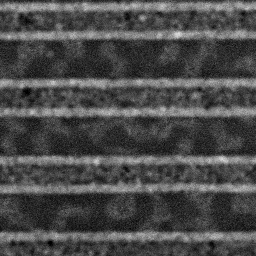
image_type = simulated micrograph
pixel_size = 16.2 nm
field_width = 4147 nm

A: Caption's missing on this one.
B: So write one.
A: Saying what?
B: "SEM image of one or a few lines or trenches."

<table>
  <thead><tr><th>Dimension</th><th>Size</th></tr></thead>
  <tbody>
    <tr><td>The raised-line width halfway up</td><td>0.445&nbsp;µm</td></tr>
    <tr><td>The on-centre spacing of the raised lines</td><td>1240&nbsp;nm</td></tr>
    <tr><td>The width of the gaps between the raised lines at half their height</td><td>0.783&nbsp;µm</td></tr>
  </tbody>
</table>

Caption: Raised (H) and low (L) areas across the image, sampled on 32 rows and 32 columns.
LLLLLLLLLLLLLLLLLLLLLLLLLLLLLLLL
HHHHHHHHHHHHHHHHHHHHHHHHHHHHHHHH
HHHHHHHHHHHHHHHHHHHHHHHHHHHHHHHH
HHHHHHHHHHHHHHHHHHHHHHHHHHHHHHHH
LLLLLLLLLLLLLLLLLLLLLLLLLLLLLLLL
LLLLLLLLLLLLLLLLLLLLLLLLLLLLLLLL
LLLLLLLLLLLLLLLLLLLLLLLLLLLLLLLL
LLLLLLLLLLLLLLLLLLLLLLLLLLLLLLLL
LLLLLLLLLLLLLLLLLLLLLLLLLLLLLLLL
LLLLLLLLLLLLLLLLLLLLLLLLLLLLLLLL
LLLLLLLHHHHHHHHHHHHHHHHHHHHHLLLL
HHHHHHHHHHHHHHHHHHHHHHHHHHHHHHHH
HHHHHHHHHHHHHHHHHHHHHHHHHHHHHHHH
HHHHHHHHHHHHHHHHHHHHHHHHHHHHHHHH
LLLLLLLLLLLLLLLLLLLLLLLLLLLLLLLL
LLLLLLLLLLLLLLLLLLLLLLLLLLLLLLLL
LLLLLLLLLLLLLLLLLLLLLLLLLLLLLLLL
LLLLLLLLLLLLLLLLLLLLLLLLLLLLLLLL
LLLLLLLLLLLLLLLLLLLLLLLLLLLLLLLL
LLLLLLLLLLLLLLLLLLLLLLLLLLLLLLLL
HHHHHHHHHHHHHHHHHHHHHHHHHHHHHHHH
HHHHHHHHHHHHHHHHHHHHHHHHHHHHHHHH
HHHHHHHHHHHHHHHHHHHHHHHHHHHHHHHH
HHHHHHHHHHHHHHHHHHLLLLLLLLLLLLLL
LLLLLLLLLLLLLLLLLLLLLLLLLLLLLLLL
LLLLLLLLLLLLLLLLLLLLLLLLLLLLLLLL
LLLLLLLLLLLLLLLLLLLLLLLLLLLLLLLL
LLLLLLLLLLLLLLLLLLLLLLLLLLLLLLLL
LLLLLLLLLLLLLLLLLLLLLLLLLLLLLLLL
LLLLLLLLLLLLLLLLLLLLLLLLLLLLLLLL
HHHHHHHHHHHHHHHHHHHHHHHHHHHHHHHH
HHHHHHHHHHHHHHHHHHHHHHHHHHHHHHHH